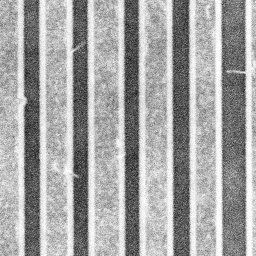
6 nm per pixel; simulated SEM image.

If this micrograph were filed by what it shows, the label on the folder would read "parallel lines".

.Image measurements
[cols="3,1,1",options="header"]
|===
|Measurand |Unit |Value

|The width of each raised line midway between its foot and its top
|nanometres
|161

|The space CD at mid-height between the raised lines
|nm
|130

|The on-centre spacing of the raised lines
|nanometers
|299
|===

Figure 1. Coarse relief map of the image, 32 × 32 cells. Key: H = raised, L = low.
HHHLLHHHHLLHHHHLLLHHHLLLHHHLLLLH
HHHLLHHHHLLHHHHLLLHHHLLLHHHLLLLH
HHHLLHHHHLLHHHHLLLHHHLLLHHHLLLLH
HHHLLHHHHLLHHHHLLLHHHLLLHHHLLLLH
HHHLLHHHHLLHHHHLLLHHHLLLHHHLLLLH
HHHLLHHHHLLHHHHLLLHHHLLLHHHLLLLH
HHHLLHHHHLLHHHHLLLHHHLLLHHHLLLLH
HHHLLHHHHLLHHHHLLLHHHLLLHHHLLLLH
HHHLLHHHHLLHHHHLLLHHHLLLHHHLLLLH
HHHLLHHHHLLHHHHLLLHHHLLLHHHLLLLH
HHHLLHHHHLLHHHHLLLHHHLLLHHHLLLLH
HHHLLHHHHLLHHHHLLLHHHLLLHHHLLLLH
HHHLLHHHHLLHHHHLLLHHHLLLHHHLLLLH
HHHLLHHHHLLHHHHLLLHHHLLLHHHLLLLH
HHHLLHHHHLLHHHHLLLHHHLLLHHHLLLLH
HHHLLHHHHLLHHHHLLLHHHLLLHHHLLLLH
HHHLLHHHHLLHHHHLLLHHHLLLHHHLLLLH
HHHLLHHHHLLHHHHLLLHHHLLLHHHLLLLH
HHHLLHHHHLLHHHHLLLHHHLLLHHHLLLLH
HHHLLHHHHLLHHHHLLLHHHLLLHHHLLLLH
HHHLLHHHHLLHHHHLLLHHHLLLHHHLLLLH
HHHLLHHHHLLHHHHLLLHHHLLLHHHLLLLH
HHHLLHHHHLLHHHHLLLHHHLLLHHHLLLLH
HHHLLHHHHLLHHHHLLLHHHLLLHHHLLLLH
HHHLLHHHHLLHHHHLLLHHHLLLHHHLLLLH
HHHLLHHHHLLHHHHLLLHHHLLLHHHLLLLH
HHHLLHHHHLLHHHHLLLHHHLLLHHHLLLLH
HHHLLHHHHLLHHHHLLLHHHLLLHHHLLLLH
HHHLLHHHHLLHHHHLLLHHHLLLHHHLLLLH
HHHLLHHHHLLHHHHLLLHHHLLLHHHLLLLH
HHHLLHHHHLLHHHHLLLHHHLLLHHHLLLLH
HHHLLHHHHLLHHHHLLLHHHLLLHHHLLLLH